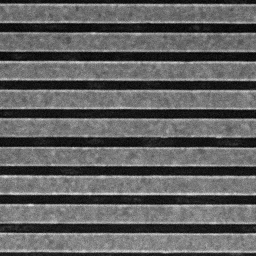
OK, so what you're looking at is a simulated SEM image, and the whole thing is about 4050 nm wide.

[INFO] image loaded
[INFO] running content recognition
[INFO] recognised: parallel lines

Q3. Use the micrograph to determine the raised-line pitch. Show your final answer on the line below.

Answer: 0.453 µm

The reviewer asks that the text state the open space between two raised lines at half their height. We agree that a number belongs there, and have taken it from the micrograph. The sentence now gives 162 nanometers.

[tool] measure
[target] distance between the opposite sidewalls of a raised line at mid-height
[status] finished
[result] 295 nanometres